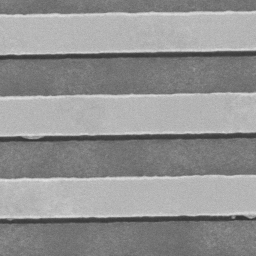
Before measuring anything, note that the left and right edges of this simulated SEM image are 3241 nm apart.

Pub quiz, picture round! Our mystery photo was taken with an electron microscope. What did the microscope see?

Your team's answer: lines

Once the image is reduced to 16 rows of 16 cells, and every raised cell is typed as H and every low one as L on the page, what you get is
LLLLLLLLLLLLLLLL
HHHHHHHHHHHHHHHH
HHHHHHHHHHHHHHHH
LLLLLLLLLLLLLLLL
LLLLLLLLLLLLLLLL
LLLLLLLLLLLLLLLL
HHHHHHHHHHHHHHHH
HHHHHHHHHHHHHHHH
HHLLLLLLLLLLLLLL
LLLLLLLLLLLLLLLL
LLLLLLLLLLLLLLLL
HHHHHHHHHHHHHHHH
HHHHHHHHHHHHHHHH
HHHHHHHHHLLLLLLL
LLLLLLLLLLLLLLLL
LLLLLLLLLLLLLLLL